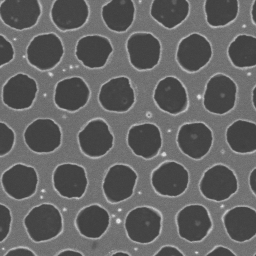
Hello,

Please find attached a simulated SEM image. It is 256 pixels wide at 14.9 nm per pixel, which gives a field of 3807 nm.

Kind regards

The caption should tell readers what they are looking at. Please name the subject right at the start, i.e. a regular array of holes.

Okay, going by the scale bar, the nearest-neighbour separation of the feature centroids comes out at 0.705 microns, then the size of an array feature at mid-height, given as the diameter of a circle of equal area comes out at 518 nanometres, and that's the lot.